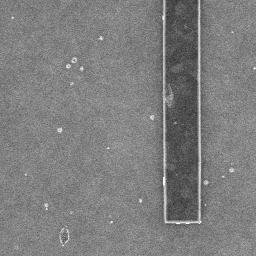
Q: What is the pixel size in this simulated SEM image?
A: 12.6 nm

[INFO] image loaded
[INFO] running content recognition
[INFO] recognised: one or a few lines or trenches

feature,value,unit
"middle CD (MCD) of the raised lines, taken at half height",445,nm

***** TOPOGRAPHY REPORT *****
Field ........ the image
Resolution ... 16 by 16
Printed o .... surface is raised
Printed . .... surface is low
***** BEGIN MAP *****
..........oo....
..........oo....
..........oo....
..........oo....
..........oo....
..........oo....
..........oo....
..........oo....
..........oo....
..........oo....
..........oo....
..........oo....
..........oo....
..........oo....
................
................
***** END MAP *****